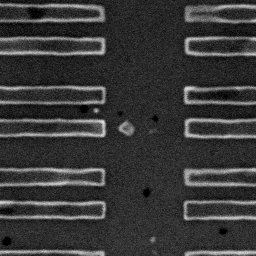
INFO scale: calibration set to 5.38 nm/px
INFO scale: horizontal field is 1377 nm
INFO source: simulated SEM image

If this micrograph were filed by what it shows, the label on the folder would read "wiring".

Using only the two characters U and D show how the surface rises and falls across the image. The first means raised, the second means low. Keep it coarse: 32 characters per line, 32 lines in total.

DDDDDDDDDDDDDDDDDDDDDDDDDDDDDDDD
UUUUUUUUUUUUUDDDDDDDDDDUUUUUUUUU
UUUUUUUUUUUUUDDDDDDDDDDDDDUUUUUU
DDDDDDDDDDDDDDDDDDDDDDDDDDDDDDDD
DDDDDDDDDDDDDDDDDDDDDDDDDDDDDDDD
UUUUUUUUUUUUUDDDDDDDDDDUUUUUUUUU
UUUUUUUUUUUUUDDDDDDDDDDDUUUUUUUU
DDDDDDDDDDDDDDDDDDDDDDDDDDDDDDDD
DDDDDDDDDDDDDDDDDDDDDDDDDDDDDDDD
DDDDDDDDDDDDDDDDDDDDDDDDDDDDDDDD
DDDDDDDDDDDDDDDDDDDDDDDDDDDDDDDD
UUUUUUUUUUUUUDDDDDDDDDDUUUUUUUUU
UUUUUUUUUUUUUDDDDDDDDDDUUUUUUUUU
DDDDDDDDDDDDDDDDDDDDDDDDDDDDDDDD
DDDDDDDDDDDDDDDDDDDDDDDDDDDDDDDD
UUUUUUUUUUUUUDDDDDDDDDDUUUUUUUUU
UUUUUUUUUUUUUDDUDDDDDDDUUUUUUUUU
DDDDDDDDDDDDDDDDDDDDDDDDDDDDDDDD
DDDDDDDDDDDDDDDDDDDDDDDDDDDDDDDD
DDDDDDDDDDDDDDDDDDDDDDDDDDDDDDDD
DDDDDDDDDDDDDDDDDDDDDDDDDDDDDDDD
UUUUUUUUUUUUUDDDDDDDDDDDUUUUUUUU
UUUUUUUUUUUUUDDDDDDDDDDUUUUUUUUU
DDDDDDDDDDDDDDDDDDDDDDDDDDDDDDDD
DDDDDDDDDDDDDDDDDDDDDDDDDDDDDDDD
UUUUUUUUUUUUUDDDDDDDDDDUUUUUUUUU
UUUUUUUUUUUUUDDDDDDDDDDUUUUUUUUU
DDDDDDDDDDDDDDDDDDDDDDDDDDDDDDDD
DDDDDDDDDDDDDDDDDDDDDDDDDDDDDDDD
DDDDDDDDDDDDDDDDDDDDDDDDDDDDDDDD
DDDDDDDDDDDDDDDDDDDDDDDDDDDDDDDD
UUUUUUUUUUDDDDDDDDDDDDDDDDDDDDDD